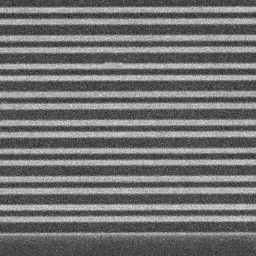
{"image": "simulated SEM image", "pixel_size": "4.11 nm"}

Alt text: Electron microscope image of parallel lines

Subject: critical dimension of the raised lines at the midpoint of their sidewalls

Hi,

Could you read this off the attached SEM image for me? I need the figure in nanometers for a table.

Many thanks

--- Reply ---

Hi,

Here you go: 20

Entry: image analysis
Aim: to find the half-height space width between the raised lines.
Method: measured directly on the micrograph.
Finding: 38.8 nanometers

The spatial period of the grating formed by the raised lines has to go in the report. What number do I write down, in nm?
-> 57.3